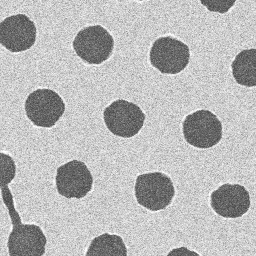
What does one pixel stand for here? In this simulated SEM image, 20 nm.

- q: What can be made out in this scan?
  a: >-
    a regular array of holes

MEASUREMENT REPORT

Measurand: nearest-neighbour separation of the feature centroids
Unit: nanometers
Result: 1540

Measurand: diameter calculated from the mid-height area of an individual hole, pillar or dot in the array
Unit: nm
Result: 785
